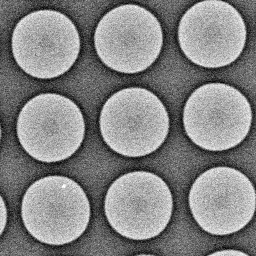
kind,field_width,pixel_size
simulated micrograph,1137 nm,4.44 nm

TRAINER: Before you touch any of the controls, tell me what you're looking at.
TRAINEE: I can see an array of small figures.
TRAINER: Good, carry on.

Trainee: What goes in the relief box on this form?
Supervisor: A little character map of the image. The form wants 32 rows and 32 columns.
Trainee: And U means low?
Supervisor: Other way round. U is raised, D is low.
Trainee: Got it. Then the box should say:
DDDDDDDDDDDDDDDDDDDDDDDDDUUUDDDD
DDDDUUUDDDDDDDUUUUUDDDDUUUUUUUDD
DDDUUUUUUDDDDUUUUUUUDDDUUUUUUUDD
DDUUUUUUUDDDUUUUUUUUDDUUUUUUUUUD
DDUUUUUUUUDDUUUUUUUUDDUUUUUUUUUD
DDUUUUUUUUDDUUUUUUUUDDDUUUUUUUUD
DDUUUUUUUUDDUUUUUUUUDDDUUUUUUUDD
DDUUUUUUUDDDDUUUUUUDDDDDUUUUUDDD
DDDUUUUUUDDDDDUUUUDDDDDDDDDDDDDD
DDDDUUUDDDDDDDDDDDDDDDDDDDDDDDDD
DDDDDDDDDDDDDDDDDDDDDDDDDDUDDDDD
DDDDDDDDDDDDDDDUUUUDDDDDUUUUUUDD
DDDDUUUUUDDDDDUUUUUUDDDDUUUUUUUD
DDDUUUUUUUDDDUUUUUUUUDDUUUUUUUUD
DDUUUUUUUUDDDUUUUUUUUDDUUUUUUUUD
DDUUUUUUUUDDDUUUUUUUUDDUUUUUUUUD
DDUUUUUUUUDDDUUUUUUUUDDUUUUUUUUD
DDUUUUUUUUDDDUUUUUUUDDDDUUUUUUDD
DDDUUUUUUUDDDDUUUUUUDDDDDDUUUDDD
DDDDUUUUUDDDDDDDDDDDDDDDDDDDDDDD
DDDDDDDDDDDDDDDDDDDDDDDDDDDDDDDD
DDDDDDDDDDDDDDDDDDDDDDDDDDUUUUDD
DDDDDUUUUDDDDDDUUUUUDDDDDUUUUUUD
DDDDUUUUUUDDDDUUUUUUUDDDUUUUUUUU
DDDUUUUUUUUDDUUUUUUUUDDDUUUUUUUU
UDDUUUUUUUUDDUUUUUUUUDDDUUUUUUUU
UDDUUUUUUUUDDUUUUUUUUDDDUUUUUUUU
UDDUUUUUUUUDDDUUUUUUUDDDDUUUUUUD
DDDUUUUUUUUDDDUUUUUUDDDDDUUUUUDD
DDDDUUUUUUDDDDDDUUUDDDDDDDDDDDDD
DDDDDDUDDDDDDDDDDDDDDDDDDDDDDDDD
DDDDDDDDDDDDDDDDDDDDDDDDDDDUUUDD